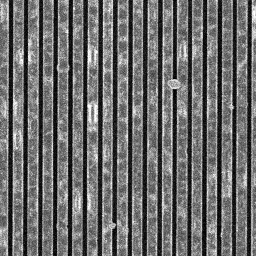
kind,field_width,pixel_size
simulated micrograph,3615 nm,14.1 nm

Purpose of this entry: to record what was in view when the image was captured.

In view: parallel lines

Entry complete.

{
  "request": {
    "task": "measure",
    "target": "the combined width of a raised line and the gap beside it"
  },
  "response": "211 nm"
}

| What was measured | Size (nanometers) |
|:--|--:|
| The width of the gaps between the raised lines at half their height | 75.9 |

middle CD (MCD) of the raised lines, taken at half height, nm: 138